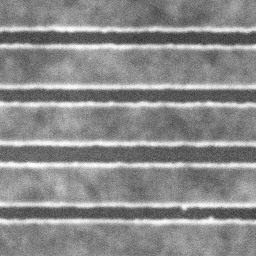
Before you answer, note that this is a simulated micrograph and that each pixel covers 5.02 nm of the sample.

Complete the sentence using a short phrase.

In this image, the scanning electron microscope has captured lines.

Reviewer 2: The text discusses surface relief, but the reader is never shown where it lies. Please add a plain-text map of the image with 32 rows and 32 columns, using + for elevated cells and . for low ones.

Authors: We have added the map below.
++++++++++++++++++++++++++++++++
++++++++++++++++++++++++++++++++
++++++++++++++++++++++++++++++++
++++++++++++++++++++++++++++++++
................................
................................
++++++++++++++++++++++++++++++++
++++++++++++++++++++++++++++++++
++++++++++++++++++++++++++++++++
++++++++++++++++++++++++++++++++
++++++++++++++++++++++++++++++++
................................
................................
++++++++++++++++++++++++++++++++
++++++++++++++++++++++++++++++++
++++++++++++++++++++++++++++++++
++++++++++++++++++++++++++++++++
++++++++++++++++++++++++++++++++
................................
................................
++.+.....+....++................
++++++++++++++++++++++++++++++++
++++++++++++++++++++++++++++++++
++++++++++++++++++++++++++++++++
++++++++++++++++++++++++++++++++
++++++++++++++++++++++++++++++++
................................
................................
++++++++++++++++++++++++++++++++
++++++++++++++++++++++++++++++++
++++++++++++++++++++++++++++++++
++++++++++++++++++++++++++++++++